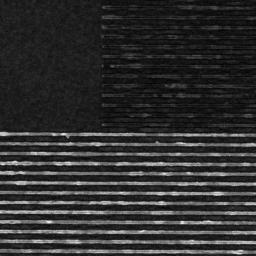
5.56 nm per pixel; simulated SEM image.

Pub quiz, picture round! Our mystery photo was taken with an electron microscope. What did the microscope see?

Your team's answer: parallel lines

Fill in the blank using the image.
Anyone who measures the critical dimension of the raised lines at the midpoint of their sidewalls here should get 13.9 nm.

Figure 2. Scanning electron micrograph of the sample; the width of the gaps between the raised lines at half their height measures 0.0403 microns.